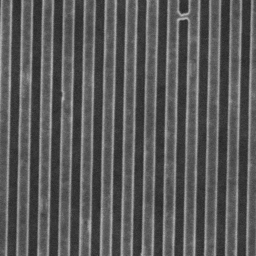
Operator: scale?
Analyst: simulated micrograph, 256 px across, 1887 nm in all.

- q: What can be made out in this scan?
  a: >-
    parallel lines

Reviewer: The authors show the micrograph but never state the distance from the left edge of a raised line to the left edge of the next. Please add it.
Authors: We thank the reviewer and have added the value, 154 nm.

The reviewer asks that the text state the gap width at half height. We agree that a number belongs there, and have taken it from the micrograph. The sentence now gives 75.5 nm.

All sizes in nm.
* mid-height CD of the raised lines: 81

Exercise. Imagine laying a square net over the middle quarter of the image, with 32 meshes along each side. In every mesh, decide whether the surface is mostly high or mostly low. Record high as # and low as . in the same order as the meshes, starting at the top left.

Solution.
##...##...###..###..###...##...#
##...##...###..###..###...##...#
##...##...###..###..###...##...#
##...##...###..###..###...##...#
##...##...###..###..###...##...#
##...##...##...###..###...##...#
##...##...##...###..###...##...#
##...##...##...###..###...##...#
##...##...##...###..###...##...#
##...##...##...###..###...##...#
##...##...##...###..###...##...#
##...##...##...###..###...##...#
##...##...##...###..###...##...#
##...##...##...###..###...##...#
##...##...##...###..###...##...#
##...##...##...###..###..###...#
##...##...##...###..###..###...#
##...##...##...###..###..###...#
##...##...##...###..###..###...#
##...##...##...###..###..###...#
##...##...##...###..###..###...#
##...##...##...##...###..###...#
##...##...##...##...###..###...#
##..###...##...##...###..###...#
##..###...##...##...###..###...#
##..###...##...##...###..###...#
##..###...##...##...##...###..##
##..###...##...##...##...###..##
##..###..###...##...##...###..##
##..###..###...##...##...###..##
##..###..###...##...##...###..##
##..###..###...##...##...###..##